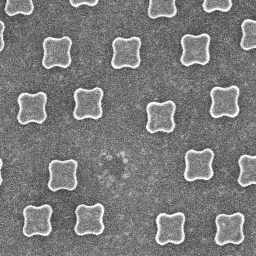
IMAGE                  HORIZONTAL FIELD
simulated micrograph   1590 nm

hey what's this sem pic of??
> a regular array of raised bodies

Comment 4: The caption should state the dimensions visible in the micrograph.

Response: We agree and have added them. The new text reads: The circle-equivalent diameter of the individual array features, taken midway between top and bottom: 191 nanometers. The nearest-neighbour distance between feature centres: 367 nanometers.